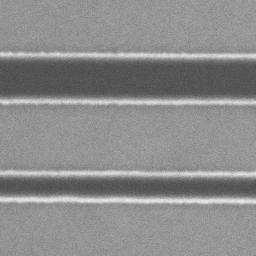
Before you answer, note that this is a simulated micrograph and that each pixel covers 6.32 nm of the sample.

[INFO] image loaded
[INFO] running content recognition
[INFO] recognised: lines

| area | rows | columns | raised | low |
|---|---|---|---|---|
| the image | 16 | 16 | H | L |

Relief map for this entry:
LLLLLLLLLLLLLLLL
LLLLLLLLLLLLLLLL
LLLLLLLLLLLLLLLL
HHHHHHHHHHHHHHHH
HHHHHHHHHHHHHHHH
HHHHHHHHHHHHHHHH
LLLLLLLLLLLLLLLL
LLLLLLLLLLLLLLLL
LLLLLLLLLLLLLLLL
LLLLLLLLLLLLLLLL
LLLLLLLLLLLLLLLL
HHHHHHHHHHHHHHHH
HHHHHHHHHHHHHHHH
LLLLLLLLLLLLLLLL
LLLLLLLLLLLLLLLL
LLLLLLLLLLLLLLLL